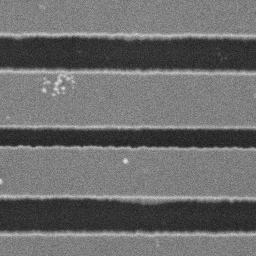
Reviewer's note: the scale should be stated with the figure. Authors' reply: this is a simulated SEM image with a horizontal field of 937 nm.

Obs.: lines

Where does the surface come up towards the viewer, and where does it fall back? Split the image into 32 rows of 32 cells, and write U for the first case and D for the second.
UUUUUUUUUUUUUUUUUUUUUUUUUUUUUUUU
UUUUUUUUUUUUUUUUUUUUUUUUUUUUUUUU
UUUUUUUUUUUUUUUUUUUUUUUUUUUUUUUU
UUUUUUUUUUUUUUUUUUUUUUUUUUUUUUUU
DDUDDDDDDDDDDDDUUUUUUUUDUUUUUUUU
DDDDDDDDDDDDDDDDDDDDDDDDDDDDDDDD
DDDDDDDDDDDDDDDDDDDDDDDDDDDDDDDD
DDDDDDDDDDDDDDDDDDDDDDDDDDDDDDDD
DDDDDDDDDDDDDDDDDDDDDDDDDDDDDDDD
UUUUUUUUUUUUUUUUUUUUUUUUUUUUUUUU
UUUUUUUUUUUUUUUUUUUUUUUUUUUUUUUU
UUUUUUUUUUUUUUUUUUUUUUUUUUUUUUUU
UUUUUUUUUUUUUUUUUUUUUUUUUUUUUUUU
UUUUUUUUUUUUUUUUUUUUUUUUUUUUUUUU
UUUUUUUUUUUUUUUUUUUUUUUUUUUUUUUU
UUUUUUUUUUUUUUUUUUUUUUUUUUUUUUUU
DDDDDDDDDDDDDDDDDDDDDDDDDDDDDDDD
DDDDDDDDDDDDDDDDDDDDDDDDDDDDDDDD
UUUUUUUUUUUUUUUUUUUUUUUDUDUDUUDD
UUUUUUUUUUUUUUUUUUUUUUUUUUUUUUUU
UUUUUUUUUUUUUUUUUUUUUUUUUUUUUUUU
UUUUUUUUUUUUUUUUUUUUUUUUUUUUUUUU
UUUUUUUUUUUUUUUUUUUUUUUUUUUUUUUU
UUUUUUUUUUUUUUUUUUUUUUUUUUUUUUUU
UUUUUUUUUUUUUUUUUUUUUUUUUUUUUUUU
DDDDDDDDDDDDDDDDDDDDDDDDDDDDDDDD
DDDDDDDDDDDDDDDDDDDDDDDDDDDDDDDD
DDDDDDDDDDDDDDDDDDDDDDDDDDDDDDDD
DDDDDDDDDDDDDDDDDDDDDDDDDDDDDDDD
UUUUUUUUUUUUUUUUUUUUUUUUUUUUUUUU
UUUUUUUUUUUUUUUUUUUUUUUUUUUUUUUU
UUUUUUUUUUUUUUUUUUUUUUUUUUUUUUUU